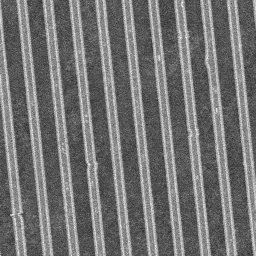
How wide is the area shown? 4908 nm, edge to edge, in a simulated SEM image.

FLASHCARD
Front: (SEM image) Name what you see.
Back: parallel lines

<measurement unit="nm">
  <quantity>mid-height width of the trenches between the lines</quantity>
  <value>350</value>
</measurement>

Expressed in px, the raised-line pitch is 26.1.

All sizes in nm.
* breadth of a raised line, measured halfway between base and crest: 150